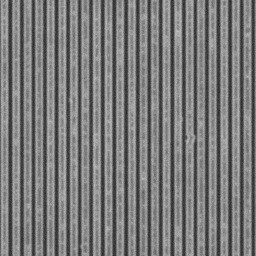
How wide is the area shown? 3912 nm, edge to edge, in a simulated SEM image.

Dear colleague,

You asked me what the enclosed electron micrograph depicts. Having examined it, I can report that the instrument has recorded parallel lines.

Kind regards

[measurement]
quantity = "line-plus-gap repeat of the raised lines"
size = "177 nm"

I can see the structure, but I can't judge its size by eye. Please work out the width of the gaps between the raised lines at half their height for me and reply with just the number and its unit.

84 nm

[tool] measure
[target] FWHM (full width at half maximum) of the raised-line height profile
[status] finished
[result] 84 nanometres